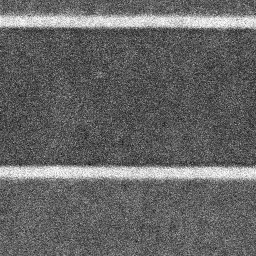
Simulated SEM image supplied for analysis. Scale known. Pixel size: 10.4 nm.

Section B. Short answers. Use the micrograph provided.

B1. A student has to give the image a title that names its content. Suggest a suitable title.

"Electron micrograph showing one or a few lines or trenches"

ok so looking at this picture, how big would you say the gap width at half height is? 153 px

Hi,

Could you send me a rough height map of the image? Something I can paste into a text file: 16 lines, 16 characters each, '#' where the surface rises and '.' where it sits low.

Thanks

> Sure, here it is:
################
................
................
................
................
................
................
................
................
................
................
################
################
################
################
################